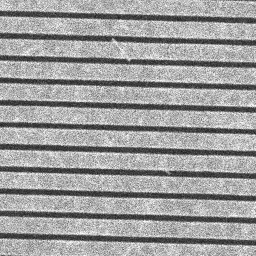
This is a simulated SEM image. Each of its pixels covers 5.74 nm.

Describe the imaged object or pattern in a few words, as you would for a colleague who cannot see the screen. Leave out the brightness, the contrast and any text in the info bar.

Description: parallel lines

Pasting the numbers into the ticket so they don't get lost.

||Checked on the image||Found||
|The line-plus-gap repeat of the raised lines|127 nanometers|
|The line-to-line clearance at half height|35.8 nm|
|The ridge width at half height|91.8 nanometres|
